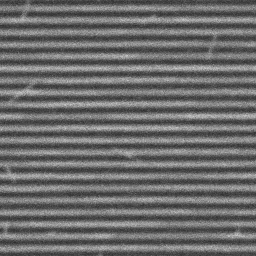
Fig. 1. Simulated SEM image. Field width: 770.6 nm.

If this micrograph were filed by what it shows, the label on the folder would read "parallel lines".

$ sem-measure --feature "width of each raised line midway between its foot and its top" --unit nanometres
16.2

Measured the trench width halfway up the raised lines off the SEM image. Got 19.2 nm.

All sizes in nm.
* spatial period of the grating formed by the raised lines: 36.1